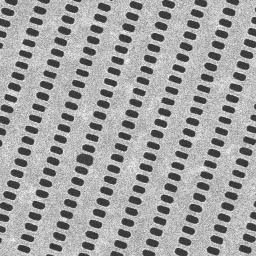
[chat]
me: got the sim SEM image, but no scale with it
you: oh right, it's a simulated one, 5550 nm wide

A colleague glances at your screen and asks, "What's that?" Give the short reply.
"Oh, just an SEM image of a regular array of holes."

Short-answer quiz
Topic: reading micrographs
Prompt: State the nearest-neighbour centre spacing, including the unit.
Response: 0.25 um